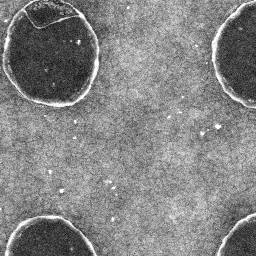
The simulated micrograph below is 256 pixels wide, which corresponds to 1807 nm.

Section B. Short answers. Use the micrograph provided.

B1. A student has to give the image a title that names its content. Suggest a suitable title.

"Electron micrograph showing raised bodies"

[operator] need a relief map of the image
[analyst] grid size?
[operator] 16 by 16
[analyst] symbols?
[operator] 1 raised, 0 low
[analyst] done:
0000000000000001
0101110000000011
1111110000000111
1111110000000111
1111110000000111
0111110000000011
0001000000000001
0000000000000000
0000000000000000
0000000000000000
0000000000000000
0000000000000000
0000000000000000
0000000000000000
0111100000000011
1111110000000011